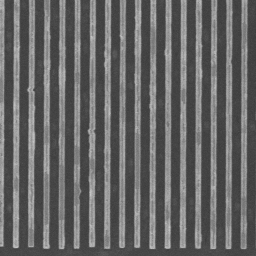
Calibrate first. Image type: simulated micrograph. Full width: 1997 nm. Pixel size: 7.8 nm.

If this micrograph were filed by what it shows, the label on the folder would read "parallel lines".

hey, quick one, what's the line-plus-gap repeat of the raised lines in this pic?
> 118 nm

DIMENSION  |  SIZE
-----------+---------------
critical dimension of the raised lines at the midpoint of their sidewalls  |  40 nm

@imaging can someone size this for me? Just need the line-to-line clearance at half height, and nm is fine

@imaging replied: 78